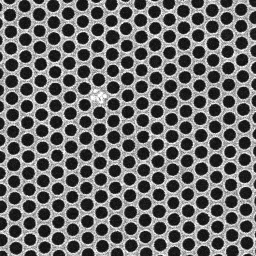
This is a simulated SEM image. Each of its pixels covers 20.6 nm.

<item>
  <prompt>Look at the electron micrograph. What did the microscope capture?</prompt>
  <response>a regular array of holes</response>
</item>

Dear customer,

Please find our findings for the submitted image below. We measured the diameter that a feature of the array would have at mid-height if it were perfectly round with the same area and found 268 nanometers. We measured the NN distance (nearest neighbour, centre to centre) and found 16.4 px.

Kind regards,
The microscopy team